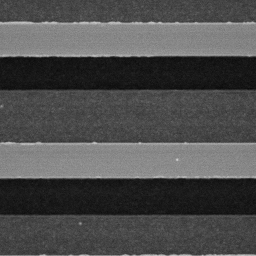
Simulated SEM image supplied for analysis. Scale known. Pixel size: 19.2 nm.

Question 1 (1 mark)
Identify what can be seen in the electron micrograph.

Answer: lines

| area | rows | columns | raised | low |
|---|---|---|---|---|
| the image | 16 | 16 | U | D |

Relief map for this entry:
UUUUUUUUUUUUUUUU
UUUUUUUUUUUUUUUU
UUUUUUUUUUUUUUUU
UUUUUUUUUUDDDDDU
DDDDDDDDDDDDDDDD
DDDDDDDDDDDDDDDD
UUUUUUUUUUUUUUUU
UUUUUUUUUUUUUUUU
UUUUUUUUUUUUUUUU
UUUUUUUUUUUUUUUU
UUUUUUUUUUUUUUUU
DDDDDDDDDDDDDDDD
DDDDDDDDDDDDDDDD
DDDDDDDDDDDDDDDD
UUUUUUUUUUUUUUUU
UUUUUUUUUUUUUUUU